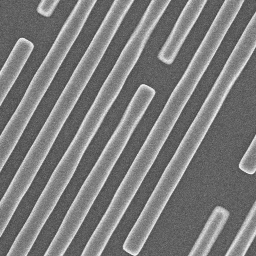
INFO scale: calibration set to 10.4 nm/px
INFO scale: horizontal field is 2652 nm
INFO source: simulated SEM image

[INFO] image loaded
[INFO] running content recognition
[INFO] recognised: groups of lines, slits or small figures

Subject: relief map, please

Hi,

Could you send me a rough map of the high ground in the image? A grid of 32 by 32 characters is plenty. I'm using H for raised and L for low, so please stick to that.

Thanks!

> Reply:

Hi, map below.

LLLLLHHLLLHHLLHHLLLHHLLHHHLLHHLL
LLLLLHLLLHHLLLHHLLHHLLLHHLLHHHLL
LLLLLLLLHHHLLHHLLLHHLLHHLLLHHLLH
LLLLLLLLHHLLHHHLLHHLLLHHLLHHHLLH
LLLLLLLHHHLLHHLLLHLLLHHLLLHHLLHH
LLHHLLLHHLLHHHLLHHLLLHHLLHHHLLHH
LHHHLLHHLLLHHLLHHHLLHHLLLHHLLHHH
LHHLLLHHLLHHHLLHHLLLHLLLHHLLHHHL
HHHLLHHLLLHHLLHHHLLLLLLLHHLLHHLL
HHLLHHHLLHHLLLHHLLLLLLLHHLLHHHLL
HHLLHHLLHHHLLHHLLLLLLLHHHLLHHLLL
HLLHHHLLHHLLHHHLLHHLLLHHLLHHLLLL
LLLHHLLHHHLLHHLLHHHLLHHHLLHHLLLL
LLHHLLLHHLLHHHLLHHLLLHHLLHHLLLLL
LLHHLLHHHLLHHLLLHHLLHHLLLHHLLLLL
LHHLLLHHLLHHLLLHHLLHHHLLHHLLLLLL
HHHLLHHLLLHHLLHHHLLHHLLHHHLLLLLL
HHLLHHHLLHHLLLHHLLHHHLLHHLLLLLLL
HHLLHHLLLHHLLHHLLLHHLLHHHLLLLLLH
HLLHHHLLHHLLLHHLLHHHLLHHLLLLLLHH
HLLHHLLHHHLLHHLLLHHLLHHHLLLLLLHH
LLHHHLLHHLLHHHLLHHLLHHHLLLLLLLLH
LLHHLLHHHLLHHLLHHHLLHHLLLLLLLLLL
LHHHLLHHLLHHHLLHHLLHHHLLLLLLLLLL
HHHLLHHHLLHHLLHHHLLHHLLLLLLLLLLL
HHLLHHHLLHHHLLHHLLHHHLLLLLLLLLLL
HHLLHHLLHHHLLHHHLLHHLLLLLLLHLLLH
HLLHHHLLHHLLLHHLLHHHLLLLLLHHLLLH
HLLHHLLHHHLLHHLLLHHLLLLLLLHHLLHH
LLHHHLLHHLLHHHLLHHHLLLLLLHHLLLHH
LLHHLLHHHLLHHLLLHHLLLLLLLHLLLHHL
LHHHLLHHLLHHHLLLHLLLLLLLHHLLHHHL